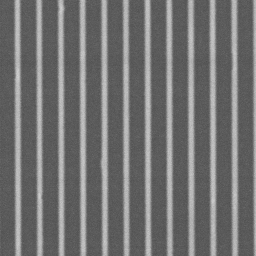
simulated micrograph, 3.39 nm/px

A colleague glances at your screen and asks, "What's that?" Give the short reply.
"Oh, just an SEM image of parallel lines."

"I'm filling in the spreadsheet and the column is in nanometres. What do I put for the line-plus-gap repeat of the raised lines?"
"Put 73.6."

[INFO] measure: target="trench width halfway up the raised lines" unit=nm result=60.3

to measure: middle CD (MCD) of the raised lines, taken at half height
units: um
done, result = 0.0144